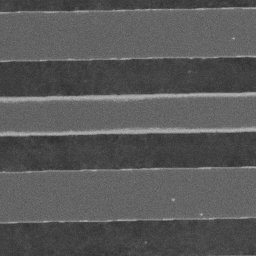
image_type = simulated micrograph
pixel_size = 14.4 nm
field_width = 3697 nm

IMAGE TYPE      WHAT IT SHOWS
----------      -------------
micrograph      lines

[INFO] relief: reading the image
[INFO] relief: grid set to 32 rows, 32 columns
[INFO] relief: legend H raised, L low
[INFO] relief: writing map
LLLLLLLLLLLLLLLLLLLLLLLLLLLLLLLL
LLHHHHHHHHHHHHHHHHHHHHHHHHHHHHHH
HHHHHHHHHHHHHHHHHHHHHHHHHHHHHHHH
HHHHHHHHHHHHHHHHHHHHHHHHHHHHHHHH
HHHHHHHHHHHHHHHHHHHHHHHHHHHHHHHH
HHHHHHHHHHHHHHHHHHHHHHHHHHHHHHHH
HHHHHHHHHHHHHHHHHHHHHHHHHHHHHHHH
HHHHHHLLLLLLLLLLLLLLLLLLLLLLLLLL
LLLLLLLLLLLLLLLLLLLLLLLLLLLLLLLL
LLLLLLLLLLLLLLLLLLLLLLLLLLLLLLLL
LLLLLLLLLLLLLLLLLLLLLLLLLLLLLLLL
LLLLLLLLLLLLLLLLLLLLLLLLLLLLLLLL
HHHHHHHHHHHHHHHHHHHHHHHHHHHHHHHH
HHHHHHHHHHHHHHHHHHHHHHHHHHHHHHHH
HHHHHHHHHHHHHHHHHHHHHHHHHHHHHHHH
HHHHHHHHHHHHHHHHHHHHHHHHHHHHHHHH
HHHHHHHHHHHHHHHHHHHHHHHHLLLLLLLL
LLLLLLLLLLLLLLLLLLLLLLLLLLLLLLLL
LLLLLLLLLLLLLLLLLLLLLLLLLLLLLLLL
LLLLLLLLLLLLLLLLLLLLLLLLLLLLLLLL
LLLLLLLLLLLLLLLLLLLLLLLLLLLLLLLL
HLLHHHHHHHHHHHHHHHHHHHHHHHHHHHHH
HHHHHHHHHHHHHHHHHHHHHHHHHHHHHHHH
HHHHHHHHHHHHHHHHHHHHHHHHHHHHHHHH
HHHHHHHHHHHHHHHHHHHHHHHHHHHHHHHH
HHHHHHHHHHHHHHHHHHHHHHHHHHHHHHHH
HHHHHHHHHHHHHHHHHHHHHHHHHHHHHHHH
HHHHHHHHHHHHHHHHHHLLLLLLLLLLLLLL
LLLLLLLLLLLLLLLLLLLLLLLLLLLLLLLL
LLLLLLLLLLLLLLLLLLLLLLLLLLLLLLLL
LLLLLLLLLLLLLLLLLLLLLLLLLLLLLLLL
LLLLLLLLLLLLLLLLLLLLLLLLLLLLLLLL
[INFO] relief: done